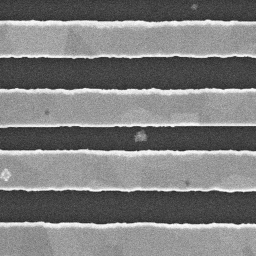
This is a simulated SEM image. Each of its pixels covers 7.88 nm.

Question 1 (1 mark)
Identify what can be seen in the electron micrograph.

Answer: lines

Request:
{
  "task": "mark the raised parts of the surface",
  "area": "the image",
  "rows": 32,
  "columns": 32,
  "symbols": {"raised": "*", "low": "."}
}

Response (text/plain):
................................
................................
................................
********************************
********************************
********************************
********************************
................................
................................
................................
................................
********************************
********************************
********************************
********************************
********************************
................................
................................
................................
********************************
********************************
********************************
********************************
********************************
................................
................................
................................
................................
********************************
********************************
********************************
********************************